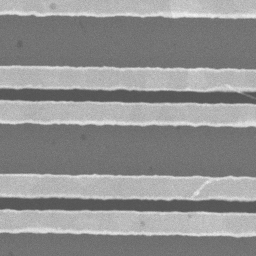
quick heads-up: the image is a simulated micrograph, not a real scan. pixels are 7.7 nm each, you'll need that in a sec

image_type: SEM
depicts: lines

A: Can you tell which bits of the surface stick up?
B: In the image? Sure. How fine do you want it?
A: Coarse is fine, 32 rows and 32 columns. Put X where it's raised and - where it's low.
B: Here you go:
XXXXXXXXXXXXXXXXXXXXXXXXXXXXXXXX
XXXXXXXXXXXXXXXXXXXXXXXXXXXXXXXX
--------------------------------
--------------------------------
--------------------------------
--------------------------------
--------------------------------
--------------------------------
XXXXXXXXXXXXXXX---XX------------
XXXXXXXXXXXXXXXXXXXXXXXXXXXXXXXX
XXXXXXXXXXXXXXXXXXXXXXXXXXXXXXXX
--------------------------------
--------------------------------
XXXXXXXXXXXXXXXXXXXXXXXXXXXXXXXX
XXXXXXXXXXXXXXXXXXXXXXXXXXXXXXXX
----------X-X--XXXXXXXXXXXXXXXXX
--------------------------------
--------------------------------
--------------------------------
--------------------------------
--------------------------------
--------------------------------
XXXXXXXXXXXXXXXXXXXXXXXXXXXXXXXX
XXXXXXXXXXXXXXXXXXXXXXXXXXXXXXXX
XXXXXXXXXXXXXXXXXXXXXXXXXXXXXXXX
--------------------------------
XXXXXXXXXXXXXXXXX---------------
XXXXXXXXXXXXXXXXXXXXXXXXXXXXXXXX
XXXXXXXXXXXXXXXXXXXXXXXXXXXXXXXX
-----------------------------XXX
--------------------------------
--------------------------------